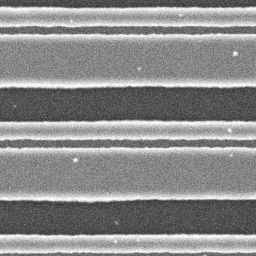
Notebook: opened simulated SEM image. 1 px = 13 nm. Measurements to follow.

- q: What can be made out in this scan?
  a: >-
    lines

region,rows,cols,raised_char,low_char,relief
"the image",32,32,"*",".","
................................
********************************
********************************
********************************
********************************
********************************
********************************
********************************
********************************
********************************
********************************
................................
................................
................................
................................
********************************
********************************
********************************
********************************
********************************
********************************
********************************
********************************
********************************
********************************
................................
................................
................................
................................
................................
********************************
********************************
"